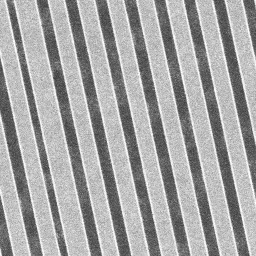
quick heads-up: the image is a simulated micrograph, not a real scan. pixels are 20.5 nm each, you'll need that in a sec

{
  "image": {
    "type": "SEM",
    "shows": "parallel lines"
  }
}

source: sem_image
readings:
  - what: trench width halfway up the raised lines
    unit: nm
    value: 248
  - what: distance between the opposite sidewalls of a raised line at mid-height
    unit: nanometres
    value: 342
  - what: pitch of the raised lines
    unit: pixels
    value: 29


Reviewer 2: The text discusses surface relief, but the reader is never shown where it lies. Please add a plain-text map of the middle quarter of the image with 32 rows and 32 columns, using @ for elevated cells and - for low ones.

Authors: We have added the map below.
@@@@---@@@@---@@@@----@@@@---@@@
@@@@---@@@@----@@@@---@@@@---@@@
@@@@---@@@@@---@@@@---@@@@---@@@
@@@@---@@@@@---@@@@---@@@@@---@@
@@@@@---@@@@---@@@@----@@@@---@@
-@@@@---@@@@---@@@@----@@@@---@@
-@@@@---@@@@----@@@@---@@@@---@@
-@@@@---@@@@@---@@@@---@@@@----@
-@@@@----@@@@---@@@@---@@@@@---@
--@@@@---@@@@---@@@@----@@@@---@
--@@@@---@@@@---@@@@@---@@@@---@
--@@@@---@@@@----@@@@---@@@@---@
--@@@@---@@@@@---@@@@---@@@@----
--@@@@----@@@@---@@@@---@@@@@---
---@@@@---@@@@---@@@@----@@@@---
---@@@@---@@@@----@@@@---@@@@---
---@@@@---@@@@@---@@@@---@@@@---
---@@@@---@@@@@---@@@@---@@@@---
---@@@@----@@@@---@@@@----@@@@--
----@@@@---@@@@---@@@@----@@@@--
@---@@@@---@@@@----@@@@---@@@@--
@---@@@@---@@@@@---@@@@---@@@@--
@---@@@@----@@@@---@@@@---@@@@@-
@----@@@@---@@@@---@@@@----@@@@-
@@---@@@@---@@@@---@@@@@---@@@@-
@@---@@@@---@@@@----@@@@---@@@@-
@@---@@@@---@@@@@---@@@@---@@@@-
@@---@@@@----@@@@---@@@@---@@@@@
@@--@@@@@@---@@@@---@@@@----@@@@
@@@---@@@@---@@@@----@@@@---@@@@
@@@---@@@@---@@@@@---@@@@---@@@@
@@@---@@@@---@@@@@---@@@@---@@@@